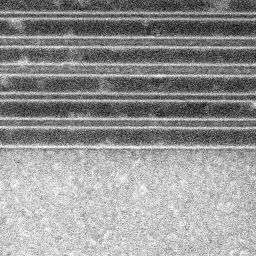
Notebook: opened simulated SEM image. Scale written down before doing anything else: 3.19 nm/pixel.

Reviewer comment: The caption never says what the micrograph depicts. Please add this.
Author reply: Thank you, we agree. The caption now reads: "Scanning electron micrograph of parallel lines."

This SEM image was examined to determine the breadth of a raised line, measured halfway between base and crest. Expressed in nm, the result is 61.8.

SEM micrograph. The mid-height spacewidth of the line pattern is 23.1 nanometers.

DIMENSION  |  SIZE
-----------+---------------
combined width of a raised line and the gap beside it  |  87 nanometres